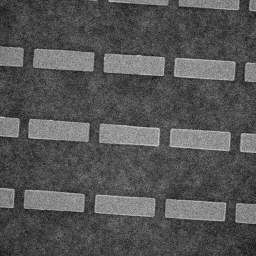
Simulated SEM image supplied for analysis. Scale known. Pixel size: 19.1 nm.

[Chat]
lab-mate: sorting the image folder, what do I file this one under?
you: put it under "an array of small figures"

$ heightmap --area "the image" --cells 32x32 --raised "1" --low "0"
00000000000000000011100111111101
00000000000000000000000000000000
00000000000000000000000000000000
00000000000000000000000000000000
00000000000000000000000000000000
00000000000000000000000000000000
11101111110000000000000000000000
11101111111101111111001110000000
00000011111101111111001111111001
00000000000000000000001111111001
00000000000000000000000000000000
00000000000000000000000000000000
00000000000000000000000000000000
00000000000000000000000000000000
00000000000000000000000000000000
11001111111000000000000000000000
11001111111011111111011111100000
00000000011001111111011111111011
00000000000000000000000011111011
00000000000000000000000000000000
00000000000000000000000000000000
00000000000000000000000000000000
00000000000000000000000000000000
00000000000000000000000000000000
11011111110011000000000000000000
11011111110011111110011111110010
00000000000011111110011111110011
00000000000000000000000000010011
00000000000000000000000000000000
00000000000000000000000000000000
00000000000000000000000000000000
00000000000000000000000000000000